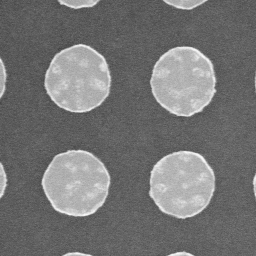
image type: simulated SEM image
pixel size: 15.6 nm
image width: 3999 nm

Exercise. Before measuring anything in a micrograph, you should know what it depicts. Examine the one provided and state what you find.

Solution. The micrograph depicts raised bodies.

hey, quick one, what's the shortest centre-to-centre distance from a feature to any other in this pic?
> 1610 nm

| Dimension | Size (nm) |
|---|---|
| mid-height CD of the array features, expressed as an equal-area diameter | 1020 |